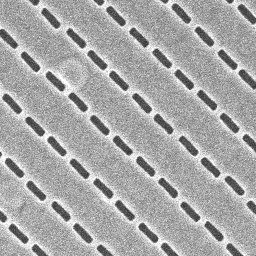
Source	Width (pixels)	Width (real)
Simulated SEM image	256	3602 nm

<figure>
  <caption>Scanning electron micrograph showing a regular array of holes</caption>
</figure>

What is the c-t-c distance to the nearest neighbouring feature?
31 pixels